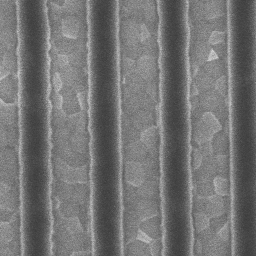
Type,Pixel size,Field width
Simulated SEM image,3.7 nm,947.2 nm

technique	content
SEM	one or a few lines or trenches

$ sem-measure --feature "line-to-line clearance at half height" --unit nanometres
146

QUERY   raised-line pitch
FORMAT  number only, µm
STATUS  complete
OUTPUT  0.26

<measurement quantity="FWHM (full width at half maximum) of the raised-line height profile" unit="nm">114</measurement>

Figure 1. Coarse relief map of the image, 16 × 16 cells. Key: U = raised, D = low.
DUUDDUUDDDUUDDUU
DUUDDUUDDDUUDDUU
DUUDDUUDDDUUDDUU
DUUDDDUDDDUUDDUU
DUUDDDUDDDUUDDUU
DUUDDDUDDDUUDDUU
DUUDDDUUDDUUDDUU
DUUDDDUUDDUUDDUU
DUUDDDUUDDUUDDUU
DUUDDDUUDDUUDDUU
DUUDDDUUDDUUDDUU
DUUDDDUUDDUUDDUU
DUUDDDUUDDUUDDUU
DUUDDDUUDDUUDDUU
DUUDDDUUDDUUDDDU
DUUDDDUUDDUUDDDU